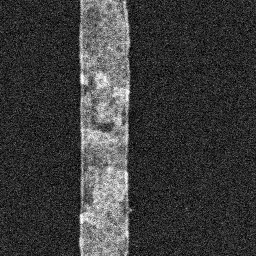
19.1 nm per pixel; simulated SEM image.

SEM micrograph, one or a few lines or trenches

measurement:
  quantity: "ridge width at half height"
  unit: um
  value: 0.876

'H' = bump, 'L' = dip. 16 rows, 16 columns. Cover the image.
LLLLLHHHLLLLLLLL
LLLLLHHHLLLLLLLL
LLLLLHHHLLLLLLLL
LLLLLHHHLLLLLLLL
LLLLLHHHLLLLLLLL
LLLLLHHHLLLLLLLL
LLLLLHHHLLLLLLLL
LLLLLHHHLLLLLLLL
LLLLLHHHLLLLLLLL
LLLLLHHHLLLLLLLL
LLLLLHHHLLLLLLLL
LLLLLHHHLLLLLLLL
LLLLLHHHLLLLLLLL
LLLLLHHHLLLLLLLL
LLLLLHHHLLLLLLLL
LLLLLHHHLLLLLLLL